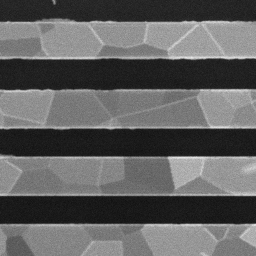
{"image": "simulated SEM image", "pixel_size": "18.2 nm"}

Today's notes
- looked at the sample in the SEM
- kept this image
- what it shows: lines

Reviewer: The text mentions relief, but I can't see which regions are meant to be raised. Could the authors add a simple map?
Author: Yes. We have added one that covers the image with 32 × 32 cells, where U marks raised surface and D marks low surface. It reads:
DDDDDDDDDDDDDDDDDDDDDDDDDDDDDDDD
DDDDDDDDDDDDDDDDDDDDDDDDDDDDDDDD
DDDDDDDDDDDDDDDDDDDDDDDDDDDDDDDD
UUUUUUUUUUUUUUUUUUUUUUUUUUUUUUUU
UUUUUUUUUUUUUUUUUUUUUUUUUUUUUUUU
UUUUUUUUUUUUUUUUUUUUUUUUUUUUUUUU
UUUUUUUUUUUUUUUUUUUUUUUUUUUUUUUU
DDDDDDDDDDDDDDDDDDDDDDDDDDDDDDDD
DDDDDDDDDDDDDDDDDDDDDDDDDDDDDDDD
DDDDDDDDDDDDDDDDDDDDDDDDDDDDDDDD
DDDDDDDDDDDDDDDDDDDDDDDDDDDDDDDD
UUUUUUUUUUUUUUUUUUUUUUUUUUUUUUUU
UUUUUUUUUUUUUUUUUUUUUUUUUUUUUUUU
UUUUUUUUUUUUUUUUUUUUUUUUUUUUUUUU
UUUUUUUUUUUUUUUUUUUUUUUUUUUUUUUU
UUUUUUUUUUUUUUUUUUUUUUUUUUUUUUUU
DDDDDDDDDDDDDDDDDDDDDDDDDDDDDDDD
DDDDDDDDDDDDDDDDDDDDDDDDDDDDDDDD
DDDDDDDDDDDDDDDDDDDDDDDDDDDDDDDD
DDDDDDDDDDDDDDDDDDDDDDDDDDDDDDDD
UUUUUUUUUUUUUUUUUUUUUUUUUUUUUUUU
UUUUUUUUUUUUUUUUUUUUUUUUUUUUUUUU
UUUUUUUUUUUUUUUUUUUUUUUUUUUUUUUU
UUUUUUUUUUUUUUUUUUUUUUUUUUUUUUUU
DDDDDDDDDDDDDDDDDDDDDDDDDDDDDDDD
DDDDDDDDDDDDDDDDDDDDDDDDDDDDDDDD
DDDDDDDDDDDDDDDDDDDDDDDDDDDDDDDD
DDDDDDDDDDDDDDDDDDDDDDDDDDDDDDDD
UUUUUUUUUUUUUUUUUUUUUUUUUUUUUUUU
UUUUUUUUUUUUUUUUUUUUUUUUUUUUUUUU
UUUUUUUUUUUUUUUUUUUUUUUUUUUUUUUU
UUUUUUUUUUUUUUUUUUUUUUUUUUUUUUUU